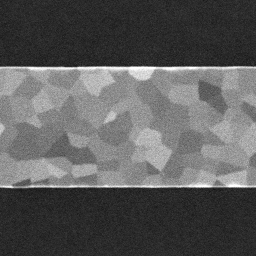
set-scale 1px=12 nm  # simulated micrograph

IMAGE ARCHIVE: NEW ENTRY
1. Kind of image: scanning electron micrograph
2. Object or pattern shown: wiring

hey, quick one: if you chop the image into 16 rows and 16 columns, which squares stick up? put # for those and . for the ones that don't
................
................
................
................
################
################
################
################
################
################
################
################
................
................
................
................